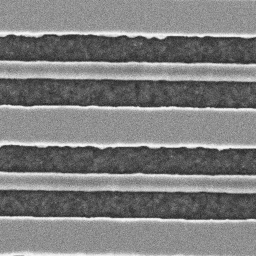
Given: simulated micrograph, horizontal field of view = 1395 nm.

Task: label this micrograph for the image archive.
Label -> lines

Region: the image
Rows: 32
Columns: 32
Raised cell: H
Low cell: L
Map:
HHHHHHHHHHHHHHHHHHHHHHHHHHHHHHHH
HHHHHHHHHHHHHHHHHHHHHHHHHHHHHHHH
HHHHHHHHHHHHHHHHHHHHHHHHHHHHHHHH
HHHHHHHHHHHHHHHHHHHHHHHHHHHHHHHH
LLLLLLLLLLLLLLLLLLHHHLLHHHHHHHHH
LLLLLLLLLLLLLLLLLLLLLLLLLLLLLLLL
LLLLLLLLLLLLLLLLLLLLLLLLLLLLLLLL
LLLLLLLLLLLLLLLLLLLLLLLLLLLLLLLL
HHHHHHHHHHHHHHHHHHHHHHHHHHHHHHHH
HHHHHHHHHHHHHHHHHHHHHHHHHHHHHHHH
LLLLLLLLLLLLLLLLLLLLLLLLLLLLLLLL
LLLLLLLLLLLLLLLLLLLLLLLLLLLLLLLL
LLLLLLLLLLLLLLLLLLLLLLLLLLLLLLLL
HHHHHHHHHHHHHHHHHLLLLHLLLLLLLLLL
HHHHHHHHHHHHHHHHHHHHHHHHHHHHHHHH
HHHHHHHHHHHHHHHHHHHHHHHHHHHHHHHH
HHHHHHHHHHHHHHHHHHHHHHHHHHHHHHHH
HHHHHHHHHHHHHHHHHHHHHHHHHHHHHHHH
LLLLLLLLLLLLLLLLLLLLLLLLLLLLLLLL
LLLLLLLLLLLLLLLLLLLLLLLLLLLLLLLL
LLLLLLLLLLLLLLLLLLLLLLLLLLLLLLLL
LLLLLLLLLLLLLLLLLLLLLLLLLLLLLLLL
HHHHHHHHHHHHHHHHHHHHHHHHHHHHHHHH
LLLHHHHHHHHHHHHHHHHHHHHHHHHHHHHH
LLLLLLLLLLLLLLLLLLLLLLLLLLLLLLLL
LLLLLLLLLLLLLLLLLLLLLLLLLLLLLLLL
LLLLLLLLLLLLLLLLLLLLLLLLLLLLLLLL
HHHHHHHHHHHHHHHHHHHHHHHLLLLLLLLH
HHHHHHHHHHHHHHHHHHHHHHHHHHHHHHHH
HHHHHHHHHHHHHHHHHHHHHHHHHHHHHHHH
HHHHHHHHHHHHHHHHHHHHHHHHHHHHHHHH
HHHHHHHHHHHHHHHHHHHHHHHHHHHHHHHH